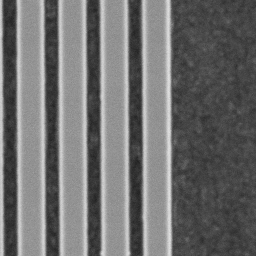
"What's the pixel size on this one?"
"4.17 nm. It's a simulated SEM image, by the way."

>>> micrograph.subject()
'parallel lines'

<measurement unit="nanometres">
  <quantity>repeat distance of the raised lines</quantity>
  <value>174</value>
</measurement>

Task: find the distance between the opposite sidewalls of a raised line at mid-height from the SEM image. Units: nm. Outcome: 110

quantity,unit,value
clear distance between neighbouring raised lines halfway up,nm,64.1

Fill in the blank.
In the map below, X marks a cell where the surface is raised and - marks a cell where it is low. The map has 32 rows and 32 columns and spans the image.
--XXX--XXXX--XXX--XXX-----------
--XXXX-XXXX--XXX--XXX-----------
--XXX--XXXX--XXX--XXX-----------
--XXX--XXXX--XXX--XXX-----------
--XXX--XXXX--XXX--XXX-----------
--XXX--XXXX--XXX--XXX-----------
--XXX--XXXX--XXX--XXX-----------
--XXX--XXXX--XXX--XXX-----------
--XXX--XXXX--XXX--XXX-----------
--XXX--XXXX--XXX--XXX-----------
--XXXX-XXXX--XXX--XXX-----------
--XXX--XXXX--XXX--XXX-----------
--XXX---XXX--XXX--XXX-----------
--XXX---XXX--XXX--XXX-----------
--XXX---XXX--XXX--XXX-----------
--XXX---XXX--XXX--XXX-----------
--XXX--XXXX--XXX--XXX-----------
--XXX---XXX--XXX--XXX-----------
--XXX---XXX--XXX--XXX-----------
--XXX---XXX--XXX--XXX-----------
--XXXX--XXX--XXX--XXX-----------
--XXXX-XXXX--XXX--XXX-----------
--XXXX-XXXX--XXX--XXX-----------
--XXXX--XXX--XXX--XXX-----------
--XXXX--XXX--XXX--XXX-----------
--XXXX--XXX--XXX--XXX-----------
--XXXX--XXX--XXX--XXX-----------
--XXXX--XXX--XXX--XXX-----------
--XXXX--XXX--XXX--XXX-----------
--XXXX--XXX--XXX--XXX-----------
--XXXX--XXX--XXX--XXX-----------
--XXXX--XXX--XXX--XXX-----------